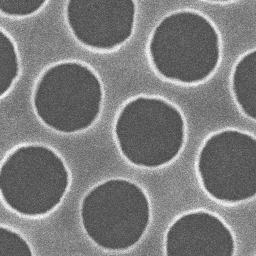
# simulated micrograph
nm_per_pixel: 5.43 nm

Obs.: holes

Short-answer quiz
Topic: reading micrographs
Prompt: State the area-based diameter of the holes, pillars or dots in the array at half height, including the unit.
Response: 0.376 µm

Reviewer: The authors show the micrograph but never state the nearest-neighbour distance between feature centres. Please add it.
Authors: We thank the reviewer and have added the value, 482 nanometers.